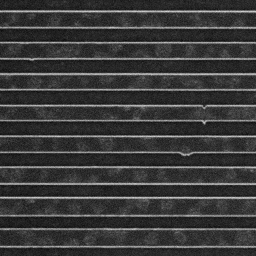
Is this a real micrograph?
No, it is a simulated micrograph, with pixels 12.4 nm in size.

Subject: parallel lines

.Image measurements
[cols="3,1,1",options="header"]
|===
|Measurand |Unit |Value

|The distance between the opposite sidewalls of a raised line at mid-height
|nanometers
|208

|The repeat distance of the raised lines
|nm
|387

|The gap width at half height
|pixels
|15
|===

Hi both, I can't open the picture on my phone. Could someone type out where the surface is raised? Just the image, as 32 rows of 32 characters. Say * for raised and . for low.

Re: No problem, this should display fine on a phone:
................................
********************************
********************************
............................*...
................................
********************************
********************************
................................
................................
********************************
********************************
................................
................................
********************************
********************************
................................
................................
********************************
********************************
................................
................................
********************************
********************************
................................
................................
********************************
********************************
................................
................................
********************************
********************************
................................